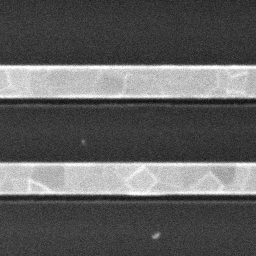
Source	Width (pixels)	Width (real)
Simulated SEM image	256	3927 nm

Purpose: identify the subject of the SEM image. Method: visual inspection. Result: lines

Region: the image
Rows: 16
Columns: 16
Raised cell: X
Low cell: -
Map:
----------------
----------------
----------------
----------------
XXXXXXXXXXXXXXXX
XXXXXXXXXXXXXXXX
----------------
----------------
----------------
----------------
XXXXXXXXXXXXXXXX
XXXXXXXXXXXXXXXX
----------------
----------------
----------------
----------------